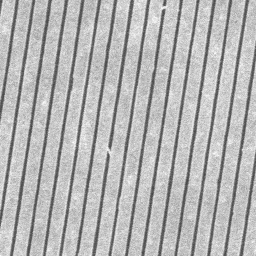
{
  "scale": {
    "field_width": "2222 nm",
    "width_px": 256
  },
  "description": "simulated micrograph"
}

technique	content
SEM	parallel lines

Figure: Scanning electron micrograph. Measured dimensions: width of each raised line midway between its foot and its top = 107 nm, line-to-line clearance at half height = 0.0311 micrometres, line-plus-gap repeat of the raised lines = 16.2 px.